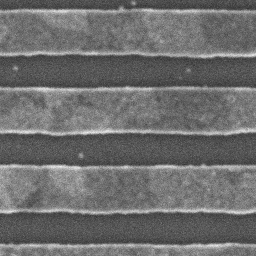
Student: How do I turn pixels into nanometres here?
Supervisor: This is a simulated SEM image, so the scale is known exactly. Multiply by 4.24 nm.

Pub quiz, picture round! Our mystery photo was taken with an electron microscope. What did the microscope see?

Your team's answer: lines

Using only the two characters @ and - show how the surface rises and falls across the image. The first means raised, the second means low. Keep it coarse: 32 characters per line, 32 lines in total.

--------------------------------
@@@@@@@@@@@@@@@@@@@@@@@@@@@@@@@@
@@@@@@@@@@@@@@@@@@@@@@@@@@@@@@@@
@@@@@@@@@@@@@@@@@@@@@@@@@@@@@@@@
@@@@@@@@@@@@@@@@@@@@@@@@@@@@@@@@
@@@@@@@@@@@@@@@@@@@@@@@@@@@@@@@@
@@@@@@@@@@@@@@@@@@@@@@@@@@@@@@@@
--------------------------------
--------------------------------
--------------------------------
--------------------------------
@@@@@@@@@@@@@@@@@@@@@@@@@@@@@@@@
@@@@@@@@@@@@@@@@@@@@@@@@@@@@@@@@
@@@@@@@@@@@@@@@@@@@@@@@@@@@@@@@@
@@@@@@@@@@@@@@@@@@@@@@@@@@@@@@@@
@@@@@@@@@@@@@@@@@@@@@@@@@@@@@@@@
@@@@@@@@@@@@@@@@@@@@@@@@@@@@@@@-
--------------------------------
--------------------------------
--------------------------------
--------------------------------
@@@@@@@@@@@@@@@@@@@@@@@@@@@@@@@@
@@@@@@@@@@@@@@@@@@@@@@@@@@@@@@@@
@@@@@@@@@@@@@@@@@@@@@@@@@@@@@@@@
@@@@@@@@@@@@@@@@@@@@@@@@@@@@@@@@
@@@@@@@@@@@@@@@@@@@@@@@@@@@@@@@@
@---------@@@@@@@@@---------@@@@
--------------------------------
--------------------------------
--------------------------------
----------------------------@@--
@@@@@@@@@@@@@@@@@@@@@@@@@@@@@@@@